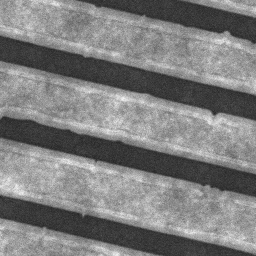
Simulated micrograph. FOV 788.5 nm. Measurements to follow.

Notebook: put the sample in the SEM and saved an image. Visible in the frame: one or a few lines or trenches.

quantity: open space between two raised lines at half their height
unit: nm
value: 96.7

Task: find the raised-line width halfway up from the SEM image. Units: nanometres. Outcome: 135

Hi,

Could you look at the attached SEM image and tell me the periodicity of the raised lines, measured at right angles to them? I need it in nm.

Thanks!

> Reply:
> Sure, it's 236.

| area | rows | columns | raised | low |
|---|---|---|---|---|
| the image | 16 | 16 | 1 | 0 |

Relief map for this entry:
1111110000000001
1111111111000000
0011111111111100
0000000111111111
1100000000011111
1111110000000001
1111111111000000
0001111111111110
0000000111111111
1110000000011111
1111111000000000
1111111111100000
0001111111111110
0000000111111111
1110000000011111
1111111000000001